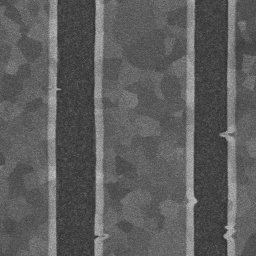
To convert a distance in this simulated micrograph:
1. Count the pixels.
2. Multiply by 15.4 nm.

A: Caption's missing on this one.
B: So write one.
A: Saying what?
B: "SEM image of one or a few lines or trenches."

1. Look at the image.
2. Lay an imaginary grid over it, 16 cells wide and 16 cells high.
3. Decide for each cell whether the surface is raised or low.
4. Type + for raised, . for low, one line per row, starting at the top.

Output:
+++...++++++..++
+++...++++++..++
+++...++++++..++
+++...++++++..++
+++...++++++..++
+++...++++++..++
+++...++++++..++
+++...++++++..++
+++...++++++..++
+++...++++++..++
+++...++++++..++
+++...++++++..++
+++...++++++..++
+++...++++++..++
+++...++++++..++
+++...++++++..++